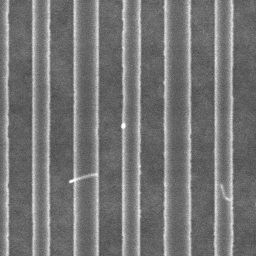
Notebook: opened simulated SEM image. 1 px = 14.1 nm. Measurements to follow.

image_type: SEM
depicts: lines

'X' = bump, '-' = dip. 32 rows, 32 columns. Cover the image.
X---XX---XXX---XX----XXX---XX---
X---XX---XXX---XX----XXX---XX---
X---XX---XXX---XX----XXX---XX---
X---XX---XXX---XX----XXX---XX---
X---XX---XXX---XX----XXX---XX---
X---XX---XXX---XX----XXX---XX---
X---XX---XXX---XX----XXX---XX---
X---XX---XXX---XX----XXX---XX---
X---XX---XXX---XX----XXX---XX---
X---XX---XXX---XX----XXX---XX---
X---XX---XXX---XX----XXX---XX---
X---XX---XXX---XX----XXX---XX---
X---XX---XXX---XX----XXX---XX---
X---XX---XXX---XX----XXX---XX---
X---XX---XXX---XX----XXX---XX---
X---XX---XXX---XX----XXX---XX---
X---XX---XXX---XX----XXX---XX---
X---XX---XXX---XX----XXX---XX---
X---XX---XXX---XX----XXX---XX---
X---XX---XXX---XX----XXX---XX---
X---XX---XXX---XX----XXX---XX---
X---XX---XXX---XX----XXX---XX---
X---XX---XXX---XX----XXX---XX---
X---XX---XXX---XX----XXX---XX---
X---XX---XXX---XX----XXX---XX---
X---XX---XXX---XX----XXX---XX---
X---XX---XXX---XX----XXX---XX---
X---XX---XXX---XX----XXX---XX---
X---XX---XXX---XX----XXX---XX---
X---XX---XXX---XX----XXX---XX---
X---XX---XXX---XX----XXX---XX---
X---XX---XXX---XX----XXX---XX---